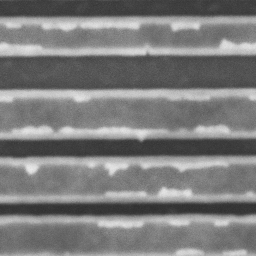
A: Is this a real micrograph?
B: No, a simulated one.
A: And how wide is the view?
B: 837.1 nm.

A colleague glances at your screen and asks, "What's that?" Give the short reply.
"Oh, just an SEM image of one or a few lines or trenches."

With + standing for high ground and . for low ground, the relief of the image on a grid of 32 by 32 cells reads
................................
................................
.............++++++++++++.++++++
++++++++++++++++++++++++++++++++
++++++++++++++++++++++++++++++++
++++++++++++++++++++++++++++++++
++++++++++.....+......+++++++...
................................
................................
................................
................................
................................
++++++++++++++++++++++++++++++++
++++++++++++++++++++++++++++++++
++++++++++++++++++++++++++++++++
++++++++++++++++++++++++++++++++
++++++++++++++++++++++++++++++++
................................
................................
................................
++++++++++++++++++++++++++++++++
++++++++++++++++++++++++++++++++
++++++++++++++++++++++++++++++++
++++++++++++++++++++++++++++++++
++++++++++++++++++++++++++++++++
................................
................................
++++++++++++++++++++++++++++++++
++++++++++++++++++++++++++++++++
++++++++++++++++++++++++++++++++
++++++++++++++++++++++++++++++++
++++++++++++++++++++++++++++++++